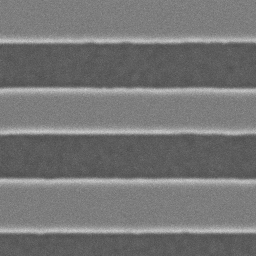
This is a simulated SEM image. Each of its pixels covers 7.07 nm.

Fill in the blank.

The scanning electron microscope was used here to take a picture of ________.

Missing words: lines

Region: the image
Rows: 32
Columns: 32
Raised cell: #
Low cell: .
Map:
################################
################################
################################
################################
################################
................................
................................
................................
................................
................................
................................
################################
################################
################################
################################
################################
################################
................................
................................
................................
................................
................................
######.############.######......
################################
################################
################################
################################
################################
################################
................................
................................
................................